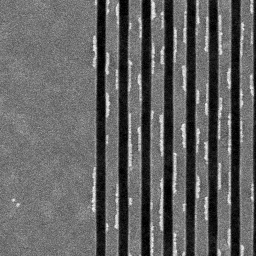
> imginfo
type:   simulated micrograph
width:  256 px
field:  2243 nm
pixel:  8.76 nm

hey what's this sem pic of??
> parallel lines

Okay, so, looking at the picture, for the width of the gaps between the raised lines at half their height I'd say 84.3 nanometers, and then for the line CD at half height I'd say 115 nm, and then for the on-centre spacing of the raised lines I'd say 196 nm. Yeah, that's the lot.